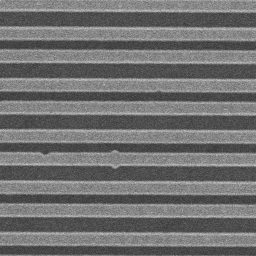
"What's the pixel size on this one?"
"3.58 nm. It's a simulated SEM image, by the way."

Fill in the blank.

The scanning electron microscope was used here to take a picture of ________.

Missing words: parallel lines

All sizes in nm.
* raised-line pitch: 92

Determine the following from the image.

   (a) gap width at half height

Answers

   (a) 56 nanometres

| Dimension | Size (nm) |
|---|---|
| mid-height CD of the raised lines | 43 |